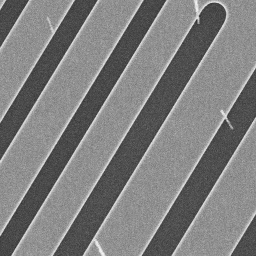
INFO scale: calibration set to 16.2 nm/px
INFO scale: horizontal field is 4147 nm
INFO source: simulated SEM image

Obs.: groups of lines, slits or small figures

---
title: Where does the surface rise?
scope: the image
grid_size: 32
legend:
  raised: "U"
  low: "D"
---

DDDUUUUUUDDDUUUUUUDDDUUUUUDUUUUU
DDDUUUUUDDDUUUUUUDDDUUUUUDDDUUUU
DDUUUUUUDDDUUUUUDDDUUUUUUDDDUUUU
DDUUUUUDDDUUUUUUDDDUUUUUDDDDUUUU
DUUUUUUDDDUUUUUDDDUUUUUDDDDUUUUU
UUUUUUDDDUUUUUUDDDUUUUUDDDUUUUUU
UUUUUDDDUUUUUUDDDUUUUUDDDDUUUUUU
UUUUUDDDUUUUUDDDUUUUUDDDDUUUUUUU
UUUUDDDUUUUUUDDDUUUUUDDDDUUUUUUU
UUUUDDUUUUUUDDDUUUUUDDDDUUUUUUUD
UUUDDDUUUUUUDDUUUUUUDDDUUUUUUUUD
UUDDDUUUUUUDDDUUUUUDDDDUUUUUUUDD
UUDDDUUUUUDDDUUUUUDDDDUUUUUUUUDD
UDDDUUUUUUDDDUUUUUDDDDUUUUUUUDDD
UDDUUUUUUDDDUUUUUDDDDUUUUUUUDDDD
DDDUUUUUUDDUUUUUUDDDUUUUUUUUDDDU
DDUUUUUUDDDUUUUUDDDDUUUUUUUDDDDU
DDUUUUUDDDUUUUUDDDDUUUUUUUDDDDUU
DUUUUUUDDDUUUUUDDDDUUUUUUUDDDDUU
UUUUUUDDDUUUUUDDDDUUUUUUUDDDDUUU
UUUUUUDDUUUUUUDDDUUUUUUUUDDDUUUU
UUUUUDDDUUUUUDDDDUUUUUUUDDDDUUUU
UUUUDDDUUUUUDDDDUUUUUUUDDDDUUUUU
UUUUDDDUUUUUDDDUUUUUUUUDDDDUUUUU
UUUDDDUUUUUDDDDUUUUUUUDDDDUUUUUU
UUDDDUUUUUUDDDUUUUUUUUDDDUUUUUUU
UUDDDUUUUUDDDDUUUUUUUDDDDUUUUUUU
UDDDUUUUUDDDDUUUUUUUDDDDUUUUUUUU
UDDDUUUUUDDDUUUUUUUUDDDDUUUUUUUD
DDDUUUUUDDDDUUUUUUUDDDDUUUUUUUDD
DDUUUUUDDDDUUUUUUUUDDDUUUUUUUUDD
DDUUUUUDDDDUUUUUUUDDDDUUUUUUUDDD